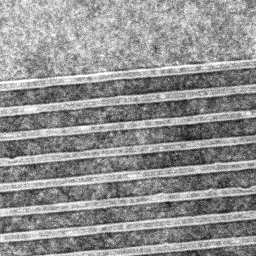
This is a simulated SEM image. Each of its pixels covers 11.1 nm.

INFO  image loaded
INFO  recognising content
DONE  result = parallel lines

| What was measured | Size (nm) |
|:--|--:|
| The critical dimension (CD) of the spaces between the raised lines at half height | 202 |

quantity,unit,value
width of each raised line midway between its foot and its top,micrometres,0.0771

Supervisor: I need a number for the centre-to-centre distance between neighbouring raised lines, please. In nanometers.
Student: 278